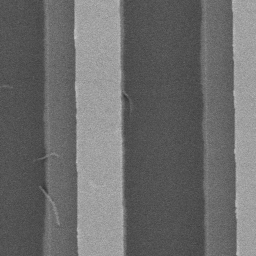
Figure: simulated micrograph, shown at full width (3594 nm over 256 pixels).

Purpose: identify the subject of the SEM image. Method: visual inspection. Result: lines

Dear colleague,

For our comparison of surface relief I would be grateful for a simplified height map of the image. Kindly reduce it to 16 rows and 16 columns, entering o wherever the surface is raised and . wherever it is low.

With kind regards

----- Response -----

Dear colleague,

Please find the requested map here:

...oooo......ooo
...oooo......ooo
...ooooo.....ooo
...ooooo.....ooo
...ooooo.....ooo
...ooooo.....ooo
...ooooo.....ooo
...ooooo.....ooo
...ooooo.....ooo
...ooooo.....ooo
...ooooo.....ooo
...ooooo.....ooo
...ooooo.....ooo
...ooooo.....ooo
...ooooo.....ooo
...ooooo.....ooo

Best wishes